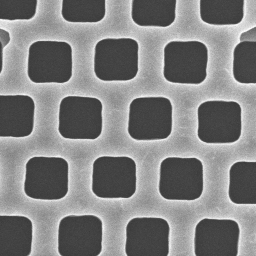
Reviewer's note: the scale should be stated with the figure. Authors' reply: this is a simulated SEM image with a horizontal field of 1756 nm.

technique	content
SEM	a regular array of holes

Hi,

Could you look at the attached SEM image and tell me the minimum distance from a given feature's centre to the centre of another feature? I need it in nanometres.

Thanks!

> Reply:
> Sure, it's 455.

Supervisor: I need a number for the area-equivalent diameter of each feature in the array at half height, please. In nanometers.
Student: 321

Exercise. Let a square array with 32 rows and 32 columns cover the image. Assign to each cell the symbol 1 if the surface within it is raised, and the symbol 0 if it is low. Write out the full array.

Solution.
00000111000001111000001110000011
00001111000001110000001110000011
10111111000001111000001110000011
11111111111111111111111111111111
11111111111111111111111111111111
11110000011100000111100001111100
11110000011100000111000000111000
11110000011100000111100000111000
11100000011100000111100000111000
11110000011100000111100000111000
11111111111111111111111011111111
11111111111111111111111111111111
00001111000011111000011111111111
00001110000001110000001110000011
00001110000001110000001110000011
00001110000001110000001110000011
00001110000001110000011110000011
11111111111111111101111110000011
11111111111111111111111111111111
11111111111111101111111111111111
11100000111100000111000001111000
11100000011100000111000001111000
11100000011100000111000001111000
11100000011100000111000001111000
11110000111100001111000001111000
11111111111111111111111111111100
11111111111111111111111111111111
00001111000011110000011110000111
00001110000001110000011100000011
00001110000001110000011100000011
00001110000001110000011100000011
00001110000011110000011100000011